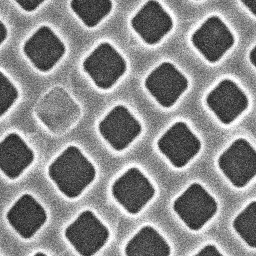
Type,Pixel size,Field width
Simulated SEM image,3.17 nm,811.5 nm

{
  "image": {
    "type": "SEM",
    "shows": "a regular array of holes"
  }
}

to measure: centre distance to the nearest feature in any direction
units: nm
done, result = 200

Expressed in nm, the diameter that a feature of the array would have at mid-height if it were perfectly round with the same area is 133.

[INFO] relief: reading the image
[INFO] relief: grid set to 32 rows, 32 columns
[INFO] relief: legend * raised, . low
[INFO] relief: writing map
**...****.....****..**********..
*********.....***....**********.
**********...***......****..****
.****.***********.....***....***
.***...**********....***.....***
***.....****..****..****.....***
***.....***....**********...***.
****....***.....**********.****.
****...***......***...**********
.**********....***.....*********
..**********..****......***...**
..*****************....***.....*
..*****************...****.....*
.*************..**********.....*
*************....**********...**
************......****.*****.***
************......***...********
...**********....***.....****..*
....****..****..****.....***....
....***....**********...***.....
....**......*********..****.....
...***......****..**********....
******......**.....**********...
*******....***.....****...******
***.****..****.....***.....*****
**...**********...****.....****.
*.....****..****.*****.....***..
*.....***....**********...***...
**...***.....*****.*****.****...
***.****......***...**********..
*********....***.....**********.
**********..****.....****...****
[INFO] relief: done